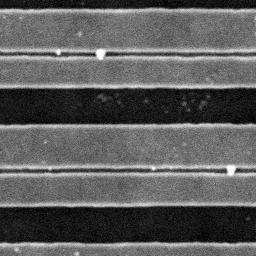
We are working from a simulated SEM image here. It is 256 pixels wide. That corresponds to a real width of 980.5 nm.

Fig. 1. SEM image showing lines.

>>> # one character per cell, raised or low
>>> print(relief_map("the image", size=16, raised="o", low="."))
................
oooooooooooooooo
oooooooooooooooo
oooooooooooooooo
oooooooooooooooo
................
................
................
oooooooooooooooo
oooooooooooooooo
oooooooooooooooo
oooooooooooooooo
oooooooooooooooo
................
................
oooooooooooooooo